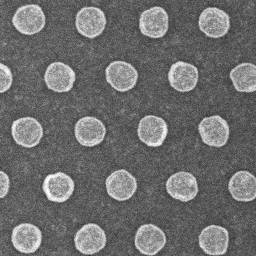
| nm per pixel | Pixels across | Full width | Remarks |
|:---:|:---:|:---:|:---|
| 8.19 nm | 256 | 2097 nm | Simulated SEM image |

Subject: a regular array of raised bodies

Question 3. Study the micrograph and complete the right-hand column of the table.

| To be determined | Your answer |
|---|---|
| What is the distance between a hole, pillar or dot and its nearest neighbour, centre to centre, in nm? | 503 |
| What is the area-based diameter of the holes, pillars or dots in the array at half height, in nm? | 243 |